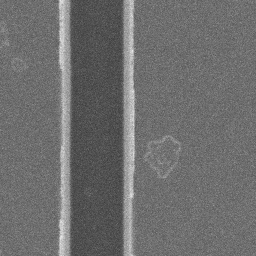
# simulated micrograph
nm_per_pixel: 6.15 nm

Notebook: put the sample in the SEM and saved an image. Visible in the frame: one or a few lines or trenches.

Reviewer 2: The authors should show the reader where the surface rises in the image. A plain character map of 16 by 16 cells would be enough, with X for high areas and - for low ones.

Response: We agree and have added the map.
XXXX----XXXXXXXX
XXXX----XXXXXXXX
XXXX----XXXXXXXX
XXXX----XXXXXXXX
XXXX----XXXXXXXX
XXXX----XXXXXXXX
XXXX----XXXXXXXX
XXXX----XXXXXXXX
XXXX----XXXXXXXX
XXXX----XXXXXXXX
XXXX----XXXXXXXX
XXXX----XXXXXXXX
XXXX----XXXXXXXX
XXXX----XXXXXXXX
XXXX----XXXXXXXX
XXXX----XXXXXXXX